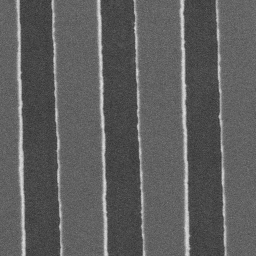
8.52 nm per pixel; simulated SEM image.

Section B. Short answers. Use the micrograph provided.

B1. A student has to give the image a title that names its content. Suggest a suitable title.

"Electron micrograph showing lines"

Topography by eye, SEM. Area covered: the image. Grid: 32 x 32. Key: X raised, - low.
XX-----XXXXX-----XXXXXX----XXXXX
XX-----XXXXX-----XXXXXX----XXXXX
XX-----XXXXX-----XXXXXX----XXXXX
XX-----XXXXX-----XXXXXX----XXXXX
XX-----XXXXXX----XXXXXX----XXXXX
XX-----XXXXXX----XXXXXX----XXXXX
XX-----XXXXXX----XXXXXX----XXXXX
XX-----XXXXXX----XXXXXX----XXXXX
XX-----XXXXXX----XXXXXX----XXXXX
XX-----XXXXXX----XXXXXX----XXXXX
XX-----XXXXXX----XXXXXX----XXXXX
XXX----XXXXXX----XXXXXX----XXXXX
XXX----XXXXXX----XXXXXX-----XXXX
XXX----XXXXXX----XXXXXX-----XXXX
XXX----XXXXXX----XXXXXX----XXXXX
XXX----XXXXXX----XXXXXX-----XXXX
XXX----XXXXXX----XXXXXX-----XXXX
XXX----XXXXXX----XXXXXX-----XXXX
XXX----XXXXXX----XXXXXX-----XXXX
XXX----XXXXXX----XXXXXX-----XXXX
XXX----XXXXXX-----XXXXX-----XXXX
XXX----XXXXXX-----XXXXX-----XXXX
XXX----XXXXXX-----XXXXX-----XXXX
XXX----XXXXXX-----XXXXX-----XXXX
XXX----XXXXXX-----XXXXX-----XXXX
XXX----XXXXXX-----XXXXX-----XXXX
XXX----XXXXXX-----XXXXX-----XXXX
XXX----XXXXXX-----XXXXX-----XXXX
XXX----XXXXXX-----XXXXX-----XXXX
XXX-----XXXXX-----XXXXXX----XXXX
XXX-----XXXXX-----XXXXXX----XXXX
XXX-----XXXXX-----XXXXXX----XXXX